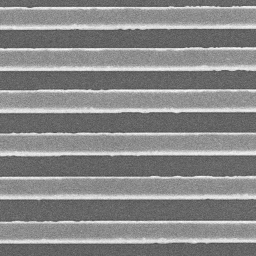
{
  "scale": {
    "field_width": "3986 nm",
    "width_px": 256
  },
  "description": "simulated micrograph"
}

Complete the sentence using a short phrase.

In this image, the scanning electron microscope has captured lines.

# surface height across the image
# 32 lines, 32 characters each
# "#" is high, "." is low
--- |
................................
################################
################################
################################
................................
................................
################################
################################
################################
................................
................................
################################
################################
################################
................................
................................
................................
################################
################################
................................
................................
................................
################################
################################
################################
................................
................................
................................
################################
################################
................................
................................